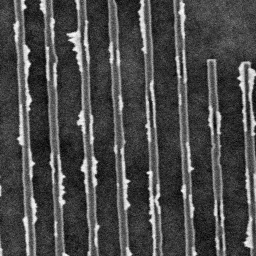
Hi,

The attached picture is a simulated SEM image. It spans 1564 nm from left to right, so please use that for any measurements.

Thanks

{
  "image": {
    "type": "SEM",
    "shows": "parallel lines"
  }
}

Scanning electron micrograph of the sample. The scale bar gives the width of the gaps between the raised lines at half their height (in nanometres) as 137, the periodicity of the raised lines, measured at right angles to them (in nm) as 194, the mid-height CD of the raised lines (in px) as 9.23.